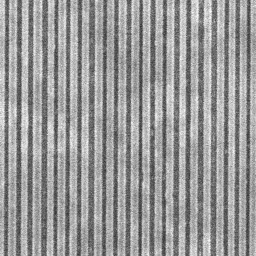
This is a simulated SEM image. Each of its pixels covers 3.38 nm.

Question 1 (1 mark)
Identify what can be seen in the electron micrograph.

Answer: parallel lines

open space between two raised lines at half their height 5.27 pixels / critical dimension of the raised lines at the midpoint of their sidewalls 23.3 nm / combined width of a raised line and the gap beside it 41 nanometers